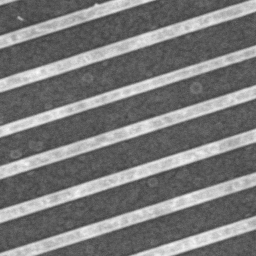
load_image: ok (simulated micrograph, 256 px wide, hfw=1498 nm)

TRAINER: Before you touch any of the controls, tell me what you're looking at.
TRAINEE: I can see parallel lines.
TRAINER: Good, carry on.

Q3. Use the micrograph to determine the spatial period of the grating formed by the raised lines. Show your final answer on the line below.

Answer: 243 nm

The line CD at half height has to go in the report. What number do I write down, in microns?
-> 0.0662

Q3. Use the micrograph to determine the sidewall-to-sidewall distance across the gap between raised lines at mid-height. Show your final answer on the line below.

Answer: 0.178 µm